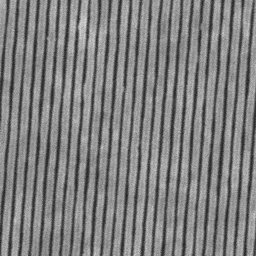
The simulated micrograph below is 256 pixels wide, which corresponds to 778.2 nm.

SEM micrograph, parallel lines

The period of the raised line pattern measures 31 nm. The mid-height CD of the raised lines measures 19.3 nm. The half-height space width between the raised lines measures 0.0114 µm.